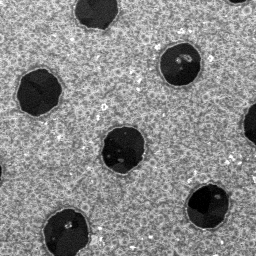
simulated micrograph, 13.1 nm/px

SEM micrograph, raised bodies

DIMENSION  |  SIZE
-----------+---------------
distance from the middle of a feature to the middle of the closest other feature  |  1340 nm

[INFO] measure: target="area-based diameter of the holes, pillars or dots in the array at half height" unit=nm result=588